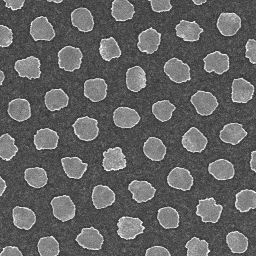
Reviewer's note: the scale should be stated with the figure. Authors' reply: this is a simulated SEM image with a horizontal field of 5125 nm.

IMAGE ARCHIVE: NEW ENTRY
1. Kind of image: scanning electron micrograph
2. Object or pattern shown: a regular array of raised bodies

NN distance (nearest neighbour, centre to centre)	0.782	µm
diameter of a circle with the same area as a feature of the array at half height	456	nm